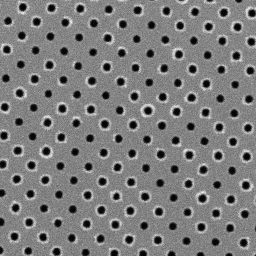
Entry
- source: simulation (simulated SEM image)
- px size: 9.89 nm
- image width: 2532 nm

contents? a regular array of holes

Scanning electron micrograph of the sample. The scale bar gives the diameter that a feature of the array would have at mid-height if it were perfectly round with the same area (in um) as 0.0781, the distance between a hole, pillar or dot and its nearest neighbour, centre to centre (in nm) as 198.